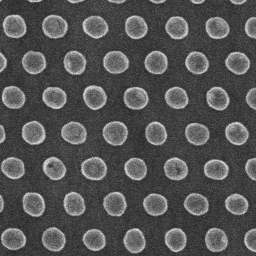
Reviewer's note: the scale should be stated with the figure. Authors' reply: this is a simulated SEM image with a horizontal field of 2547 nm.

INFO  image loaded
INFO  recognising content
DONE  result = a regular array of raised bodies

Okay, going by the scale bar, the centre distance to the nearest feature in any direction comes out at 401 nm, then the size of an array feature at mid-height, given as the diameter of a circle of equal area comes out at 221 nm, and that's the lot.